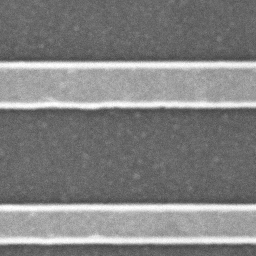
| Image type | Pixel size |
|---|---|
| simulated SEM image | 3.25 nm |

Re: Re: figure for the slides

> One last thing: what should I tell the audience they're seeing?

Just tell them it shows one or a few lines or trenches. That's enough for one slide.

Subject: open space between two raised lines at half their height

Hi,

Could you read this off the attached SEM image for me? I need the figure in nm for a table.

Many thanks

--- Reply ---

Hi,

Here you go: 334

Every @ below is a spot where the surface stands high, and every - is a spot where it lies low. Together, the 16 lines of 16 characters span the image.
----------------
----------------
----------------
----------------
@@@@@@@@@@@@@@@@
@@@@@@@@@@@@@@@@
@@@@@@@@@@--@@@@
----------------
----------------
----------------
----------------
----------------
----------------
@@@@@@@@@@@@@@@@
@@@@@@@@@@@@@@@@
----------------